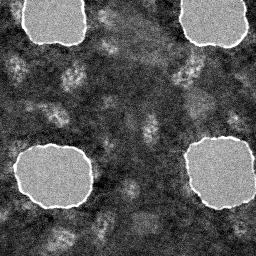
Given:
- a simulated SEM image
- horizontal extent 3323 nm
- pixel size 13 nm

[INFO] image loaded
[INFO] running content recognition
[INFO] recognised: raised bodies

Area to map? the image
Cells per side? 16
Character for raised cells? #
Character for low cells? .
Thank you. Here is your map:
..###......####.
.####......####.
..###.......###.
................
................
................
................
................
................
..###.......####
.#####......####
.#####......####
..###........###
................
................
................